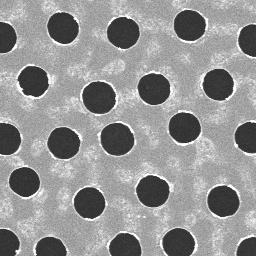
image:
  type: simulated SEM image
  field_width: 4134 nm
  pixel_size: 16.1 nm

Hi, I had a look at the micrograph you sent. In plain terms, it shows a regular array of holes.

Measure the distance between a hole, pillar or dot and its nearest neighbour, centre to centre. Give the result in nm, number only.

933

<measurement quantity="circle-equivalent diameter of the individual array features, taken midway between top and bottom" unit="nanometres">514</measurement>